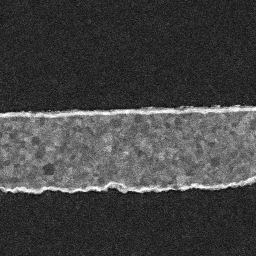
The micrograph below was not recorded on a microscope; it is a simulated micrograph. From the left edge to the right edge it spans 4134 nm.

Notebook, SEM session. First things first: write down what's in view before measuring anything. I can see one or a few lines or trenches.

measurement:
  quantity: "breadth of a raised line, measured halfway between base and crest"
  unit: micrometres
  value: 1.23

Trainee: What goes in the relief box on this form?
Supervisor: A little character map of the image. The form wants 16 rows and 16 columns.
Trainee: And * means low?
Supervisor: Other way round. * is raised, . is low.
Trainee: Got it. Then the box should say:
................
................
................
................
................
................
................
****************
****************
****************
****************
***************.
................
................
................
................